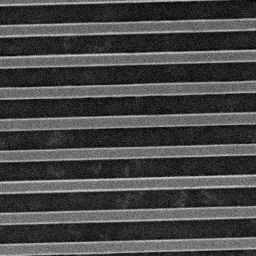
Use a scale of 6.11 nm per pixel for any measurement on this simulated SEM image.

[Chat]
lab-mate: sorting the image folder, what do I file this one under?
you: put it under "parallel lines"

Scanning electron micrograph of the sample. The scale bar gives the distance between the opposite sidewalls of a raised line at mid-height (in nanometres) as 69.5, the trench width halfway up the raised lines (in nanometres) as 122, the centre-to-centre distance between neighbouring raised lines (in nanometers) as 191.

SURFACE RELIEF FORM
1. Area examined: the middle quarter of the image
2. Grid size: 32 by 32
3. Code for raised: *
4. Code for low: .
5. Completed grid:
***.............................
................................
................................
................................
................................
.....*****.*********************
********************************
********************************
................................
................................
................................
................................
................................
********************************
********************************
******************************..
................................
................................
................................
................................
...............................*
********************************
********************************
*****************...............
................................
................................
................................
................................
...........................*****
********************************
********************************
************....................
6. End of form